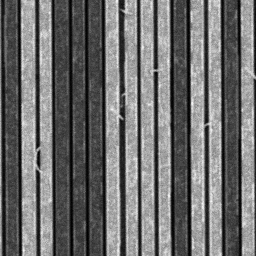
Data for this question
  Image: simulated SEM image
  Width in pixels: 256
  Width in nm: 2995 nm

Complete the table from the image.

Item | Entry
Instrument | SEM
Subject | parallel lines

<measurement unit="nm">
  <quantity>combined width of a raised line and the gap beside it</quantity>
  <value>197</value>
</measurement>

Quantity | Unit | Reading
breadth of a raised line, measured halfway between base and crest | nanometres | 145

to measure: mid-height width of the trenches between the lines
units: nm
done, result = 51.2